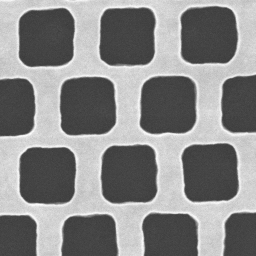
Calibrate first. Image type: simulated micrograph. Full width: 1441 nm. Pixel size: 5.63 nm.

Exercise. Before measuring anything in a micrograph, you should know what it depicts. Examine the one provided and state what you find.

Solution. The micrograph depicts a regular array of holes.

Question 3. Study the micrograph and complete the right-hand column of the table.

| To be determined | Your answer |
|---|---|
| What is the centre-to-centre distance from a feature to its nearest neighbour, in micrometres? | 0.448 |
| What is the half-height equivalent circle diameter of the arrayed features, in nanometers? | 348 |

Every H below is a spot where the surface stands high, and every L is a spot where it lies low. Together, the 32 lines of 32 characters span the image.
HHHHHHHHHHHHHHHHHHHHHHHHHHHHHHHH
HHHLLLLLLHHHHLLLLLLHHHHLLLLLLHHH
HHLLLLLLLHHHHLLLLLLHHHHLLLLLLLHH
HHLLLLLLLHHHLLLLLLLHHHHLLLLLLLHH
HHLLLLLLLHHHLLLLLLLHHHHLLLLLLLHH
HHLLLLLLLHHHLLLLLLLHHHHLLLLLLLHH
HHLLLLLLLHHHLLLLLLLHHHHLLLLLLHHH
HHHLLLLLLHHHHLLLLLLHHHHLLLLLLHHH
HHHHHHHHHHHHHHHHHHHHHHHHHHHHHHHH
HHHHHHHHHHHHHHHHHHHHLLLHHHHHHHLL
LLLLHHHHLLLLLLHHHHLLLLLLHHHHLLLL
LLLLHHHHLLLLLLHHHHLLLLLLLHHHLLLL
LLLLHHHLLLLLLLHHHHLLLLLLLHHHLLLL
LLLLLHHLLLLLLLHHHHLLLLLLLHHHLLLL
LLLLHHHHLLLLLLLHHHLLLLLLLHHHLLLL
LLLLHHHHLLLLLLHHHHLLLLLLHHHHLLLL
LLLLHHHHLLLLLLHHHHLLLLLHHHHHHLLL
HHHHHHHHHHHHHHHHHHHHHHHHHHHHHHHH
HHHHLLLLHHHHHHLLLLLHHHHLLLLLLHHH
HHHLLLLLLHHHHLLLLLLHHHHLLLLLLLHH
HHLLLLLLLHHHHLLLLLLLHHHLLLLLLLHH
HHLLLLLLLLHHHLLLLLLLHHHLLLLLLLHH
HHLLLLLLLHHHHLLLLLLLHHHLLLLLLLHH
HHLLLLLLLHHHHLLLLLLLHHHLLLLLLLHH
HHHLLLLLLHHHHLLLLLLHHHHLLLLLLHHH
HHHHHHLLHHHHHHLHHHHHHHHHHHHHHHHH
HHHHHHHHHHHHHHHHHHHHHHHHHHHHHHHH
LLLLHHHHLLLLLLHHHHLLLLLLHHHHLLLL
LLLLLHHHLLLLLLHHHHLLLLLLLHHHLLLL
LLLLLHHHLLLLLLLHHHLLLLLLLHHHLLLL
LLLLLHHHLLLLLLLHHHLLLLLLLHHHLLLL
LLLLLHHHLLLLLLLHHHLLLLLLLHHHLLLL